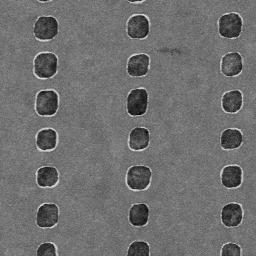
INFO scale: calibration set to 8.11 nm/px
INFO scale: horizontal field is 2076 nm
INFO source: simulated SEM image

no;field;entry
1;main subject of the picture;a regular array of holes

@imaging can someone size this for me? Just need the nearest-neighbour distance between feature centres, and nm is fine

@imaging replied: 300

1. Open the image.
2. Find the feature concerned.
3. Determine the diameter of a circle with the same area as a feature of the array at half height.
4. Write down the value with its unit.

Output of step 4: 23.3 pixels